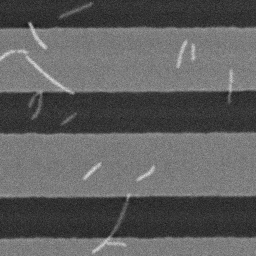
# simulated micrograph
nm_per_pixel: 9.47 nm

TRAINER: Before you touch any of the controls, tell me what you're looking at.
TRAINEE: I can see lines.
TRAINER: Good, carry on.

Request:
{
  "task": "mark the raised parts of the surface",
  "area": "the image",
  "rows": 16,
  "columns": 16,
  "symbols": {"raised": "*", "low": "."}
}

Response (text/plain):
................
................
****************
****************
****************
****************
................
................
****************
****************
****************
****************
................
................
................
****************